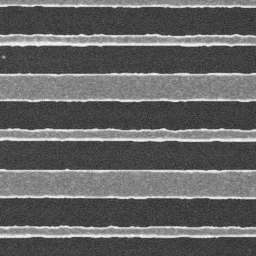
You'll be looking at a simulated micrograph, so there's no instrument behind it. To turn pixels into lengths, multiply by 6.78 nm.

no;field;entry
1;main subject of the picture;lines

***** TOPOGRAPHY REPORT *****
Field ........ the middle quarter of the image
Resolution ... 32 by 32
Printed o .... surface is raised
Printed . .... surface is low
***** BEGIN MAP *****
................................
................................
...........ooooooooo.ooo....ooo.
oooooooooooooooooooooooooooooooo
oooooooooooooooooooooooooooooooo
oooooooooooooooooooooooooooooooo
oooooooooooooooooooooooooooooooo
oooooooooooooooooooooooooooooooo
oooooooooooooooooooooooooooooooo
................................
................................
................................
................................
................................
................................
................................
.......oo.ooo...........oo......
oooooooooooooooooooooooooooooooo
oooooooooooooooooooooooooooooooo
................................
................................
................................
................................
................................
................................
................................
o...............................
oooooooooooooooooooooooooooooooo
oooooooooooooooooooooooooooooooo
oooooooooooooooooooooooooooooooo
oooooooooooooooooooooooooooooooo
oooooooooooooooooooooooooooooooo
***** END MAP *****